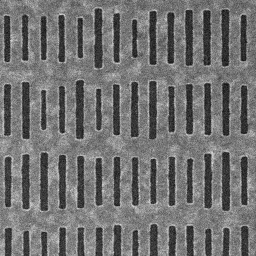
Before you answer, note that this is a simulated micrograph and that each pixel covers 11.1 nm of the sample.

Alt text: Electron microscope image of a regular array of holes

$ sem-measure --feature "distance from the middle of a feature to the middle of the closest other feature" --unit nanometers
200